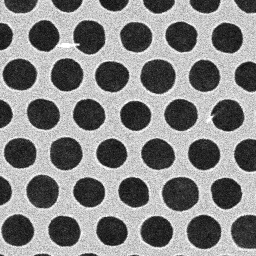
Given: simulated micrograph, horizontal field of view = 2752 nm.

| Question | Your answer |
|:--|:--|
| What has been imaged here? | a regular array of holes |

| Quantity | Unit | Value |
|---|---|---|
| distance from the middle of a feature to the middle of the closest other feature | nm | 479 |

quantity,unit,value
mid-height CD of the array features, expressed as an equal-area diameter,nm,349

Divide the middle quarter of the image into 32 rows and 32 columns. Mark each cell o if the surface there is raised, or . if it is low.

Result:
....ooooo......ooooo.......ooooo
.....ooo........ooo.........oooo
.....ooo........ooo.........ooo.
.....ooo........ooo.........ooo.
....oooo........ooo.........ooo.
....ooooo......ooooo.......ooooo
...ooooooo....ooooooo.....oooooo
ooooooooooooooooooooooo.oooooooo
oooooooooooooooooooooooooooooooo
ooo.....oooooooo....ooooooo.....
ooo.......ooooo......ooooo......
oo........oooo.......oooo.......
oo........oooo........ooo.......
oo........oooo........ooo.......
ooo.......oooo.......ooooo......
ooo......oooooo......ooooo......
ooooo...ooooooooo..ooooooooo...o
oooooooooooooooooooooooooooooooo
..ooooooooooooooooooooo.oooooooo
....ooooo.....ooooooo.....oooooo
....oooo.......ooooo.......oooo.
.....ooo........ooo.........ooo.
.....ooo........ooo.........ooo.
.....ooo........ooo.........ooo.
....ooooo......ooooo........ooo.
...ooooooo....ooooooo......ooooo
..ooooooooooooooooooooo..ooooooo
oooooooooooooooooooooooooooooooo
ooooo..ooooooooo...oooooooo....o
ooo......ooooo......oooooo......
oo........oooo.......oooo.......
oo........ooo........oooo.......